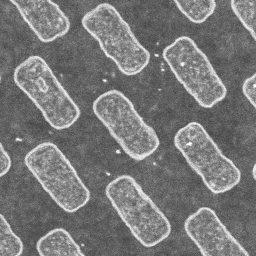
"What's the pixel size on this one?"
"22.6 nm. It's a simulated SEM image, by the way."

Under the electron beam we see raised bodies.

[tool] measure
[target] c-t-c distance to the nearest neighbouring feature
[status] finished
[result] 1900 nanometres